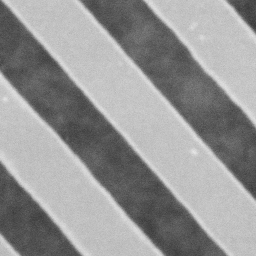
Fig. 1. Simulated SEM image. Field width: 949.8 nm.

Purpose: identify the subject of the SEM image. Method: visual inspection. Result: lines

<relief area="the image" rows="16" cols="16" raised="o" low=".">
.oooo....oooooo.
.ooooo....ooooo.
..ooooo....ooooo
...ooooo....oooo
....ooooo....ooo
o....ooooo....oo
oo....ooooo....o
ooo....ooooo....
oooo....oooo....
ooooo....oooo...
ooooo....ooooo..
.ooooo....ooooo.
..ooooo....ooooo
...ooooo....oooo
....ooooo....ooo
o....ooooo....oo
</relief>